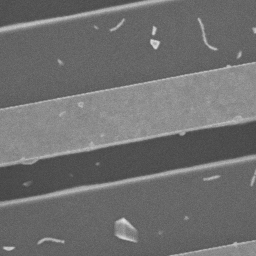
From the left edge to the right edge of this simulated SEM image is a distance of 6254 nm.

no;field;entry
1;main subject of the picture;lines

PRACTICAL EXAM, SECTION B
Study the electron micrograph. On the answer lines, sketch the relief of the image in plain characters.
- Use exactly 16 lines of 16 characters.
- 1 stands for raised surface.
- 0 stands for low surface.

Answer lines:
0000000111111111
0011111111111111
1111111111111111
1111111111111111
1111111111111111
1111111111111111
1111111111111111
1111111111111110
1111111111000000
1111000000000000
0000000000001111
0000000111111111
0111111111111111
1111111111111111
1111111111111111
1111111111111111